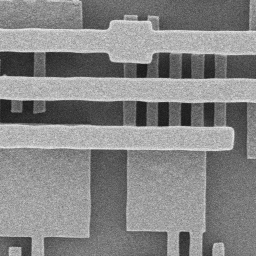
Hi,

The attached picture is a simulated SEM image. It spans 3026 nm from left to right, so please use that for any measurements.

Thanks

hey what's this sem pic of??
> wiring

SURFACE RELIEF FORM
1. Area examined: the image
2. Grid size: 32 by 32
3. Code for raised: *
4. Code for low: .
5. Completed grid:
................................
................................
................................
.............******.............
********************************
********************************
.........***.*******.***********
..............*****.............
................................
................................
********************************
********************************
..**.***..**********************
................................
................................
................................
*****************************...
*****************************...
.........********************...
................................
................................
................................
................................
................................
................................
................................
................................
................................
................................
................................
................................
................................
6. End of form